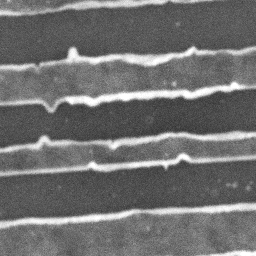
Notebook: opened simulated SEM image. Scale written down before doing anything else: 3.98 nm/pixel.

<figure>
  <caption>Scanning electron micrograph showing one or a few lines or trenches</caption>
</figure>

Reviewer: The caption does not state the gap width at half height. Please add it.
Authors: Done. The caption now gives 184 nm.